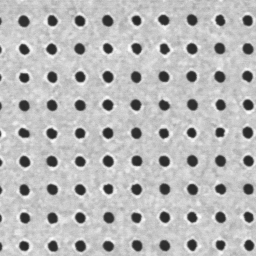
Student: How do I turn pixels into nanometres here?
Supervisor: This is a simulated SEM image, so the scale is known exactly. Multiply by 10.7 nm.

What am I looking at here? a regular array of holes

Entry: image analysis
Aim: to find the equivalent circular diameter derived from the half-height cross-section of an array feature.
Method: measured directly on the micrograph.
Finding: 0.119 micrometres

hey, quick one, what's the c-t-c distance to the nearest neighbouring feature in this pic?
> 296 nm